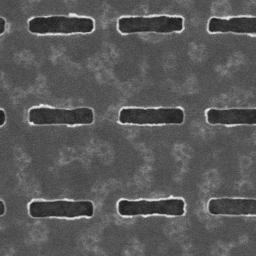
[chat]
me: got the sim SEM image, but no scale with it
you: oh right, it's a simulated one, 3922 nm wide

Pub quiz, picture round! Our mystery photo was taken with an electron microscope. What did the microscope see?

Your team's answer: holes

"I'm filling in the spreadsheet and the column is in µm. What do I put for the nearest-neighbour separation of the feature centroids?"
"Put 1.38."